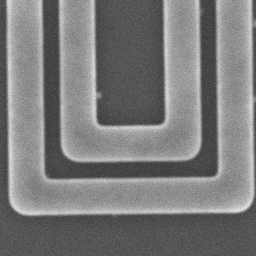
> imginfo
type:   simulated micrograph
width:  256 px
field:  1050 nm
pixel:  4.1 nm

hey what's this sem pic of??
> groups of lines, slits or small figures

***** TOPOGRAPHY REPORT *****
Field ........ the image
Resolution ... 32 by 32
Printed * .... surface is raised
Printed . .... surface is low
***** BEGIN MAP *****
.****..*****.........****..****.
.****..*****.........****..****.
.****...****.........****..****.
.****...****.........****..****.
.****...****.........****..****.
.****...****.........****..****.
.****...****.........****..****.
.****...****.........****..****.
.****...****.........****..****.
.****...****.........****..****.
.****...****.........****..****.
.****...****.........****..*****
.****...****.........****..*****
.****...****.........****..*****
.****...****.........****..*****
.****...****........*****..*****
.****...*****************..*****
.****...*****************..*****
.****...*****************..*****
.****...****************...*****
.****......................*****
.*****.....................*****
.******.************************
.*******************************
.*******************************
.******************************.
..**************************....
................................
................................
................................
................................
................................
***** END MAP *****